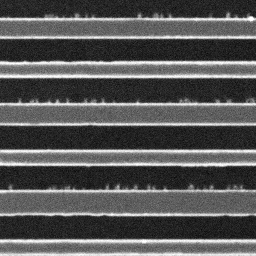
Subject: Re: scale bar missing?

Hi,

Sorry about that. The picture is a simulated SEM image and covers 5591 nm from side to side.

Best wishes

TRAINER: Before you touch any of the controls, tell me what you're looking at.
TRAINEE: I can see lines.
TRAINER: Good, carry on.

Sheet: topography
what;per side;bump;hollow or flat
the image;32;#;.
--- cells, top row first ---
................................
................................
################################
################################
################################
................................
................................
................................
################################
################################
................................
................................
................................
################################
################################
.###############################
................................
................................
................................
################################
################################
................................
................................
................................
################################
################################
################################
................................
................................
................................
################################
################################